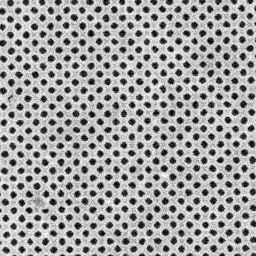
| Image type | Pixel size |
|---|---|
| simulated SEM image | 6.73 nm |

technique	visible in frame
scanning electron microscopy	a regular array of holes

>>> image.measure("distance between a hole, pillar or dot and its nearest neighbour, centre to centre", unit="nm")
73.3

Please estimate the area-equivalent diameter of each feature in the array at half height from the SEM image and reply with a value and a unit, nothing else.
53.2 nanometres